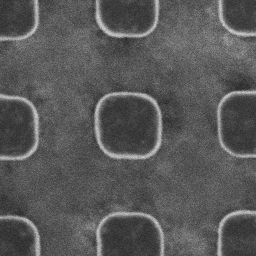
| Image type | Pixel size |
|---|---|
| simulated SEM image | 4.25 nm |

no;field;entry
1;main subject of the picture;raised bodies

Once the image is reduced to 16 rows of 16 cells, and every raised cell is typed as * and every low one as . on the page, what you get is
**....****....**
**....****....**
................
................
................
................
**....****....**
**....****....**
**....****....**
**.....***....**
................
................
................
.......**.....**
**....****....**
**....****....**